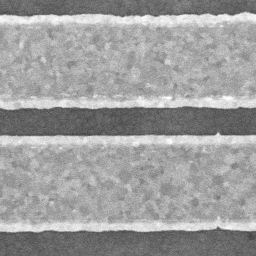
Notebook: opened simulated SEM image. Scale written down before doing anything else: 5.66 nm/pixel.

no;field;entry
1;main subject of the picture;one or a few lines or trenches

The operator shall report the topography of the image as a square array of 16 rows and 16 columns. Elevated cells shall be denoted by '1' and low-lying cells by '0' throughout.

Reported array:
0000000000000000
1111111111111111
1111111111111111
1111111111111111
1111111111111111
1111111111111111
1010011100000000
0000000000000000
0000000000000000
1111111111111111
1111111111111111
1111111111111111
1111111111111111
1111111111111111
0000000000000000
0000000000000000